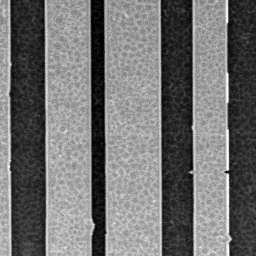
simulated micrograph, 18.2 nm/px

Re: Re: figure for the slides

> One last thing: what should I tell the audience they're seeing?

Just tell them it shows one or a few lines or trenches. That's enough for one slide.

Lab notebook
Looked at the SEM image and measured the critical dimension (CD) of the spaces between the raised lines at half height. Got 0.612 um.